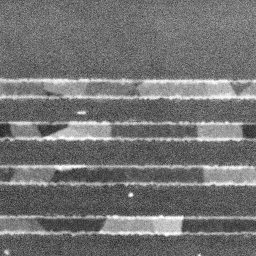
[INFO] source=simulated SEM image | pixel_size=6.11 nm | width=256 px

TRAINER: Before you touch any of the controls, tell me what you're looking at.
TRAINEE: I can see lines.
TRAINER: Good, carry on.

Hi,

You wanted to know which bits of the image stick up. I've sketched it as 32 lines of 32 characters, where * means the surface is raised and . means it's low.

................................
................................
................................
................................
................................
................................
................................
................................
................................
................................
********************************
********************************
................................
................................
................................
********************************
********************************
................................
................................
................................
................................
********************************
********************************
................................
................................
................................
................................
********************************
********************************
................................
................................
................................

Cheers